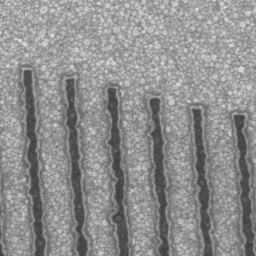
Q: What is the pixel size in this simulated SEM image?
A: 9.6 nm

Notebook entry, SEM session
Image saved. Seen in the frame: parallel lines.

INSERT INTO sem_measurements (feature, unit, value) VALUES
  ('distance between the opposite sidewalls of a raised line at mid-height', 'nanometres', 115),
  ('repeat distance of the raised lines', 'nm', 400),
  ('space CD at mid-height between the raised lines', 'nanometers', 286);